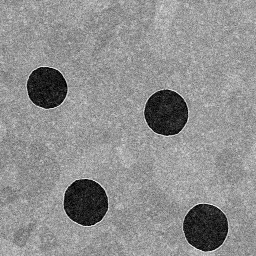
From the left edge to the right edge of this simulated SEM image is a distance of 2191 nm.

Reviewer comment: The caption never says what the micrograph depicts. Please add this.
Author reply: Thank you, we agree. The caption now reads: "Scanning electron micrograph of holes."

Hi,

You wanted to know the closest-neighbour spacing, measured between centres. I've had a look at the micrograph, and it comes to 1030 nm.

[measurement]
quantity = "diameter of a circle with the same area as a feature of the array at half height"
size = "0.393 microns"